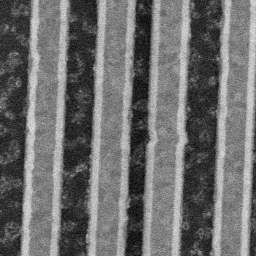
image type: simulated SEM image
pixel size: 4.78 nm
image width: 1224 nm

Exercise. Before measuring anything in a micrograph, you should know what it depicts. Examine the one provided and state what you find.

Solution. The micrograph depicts one or a few lines or trenches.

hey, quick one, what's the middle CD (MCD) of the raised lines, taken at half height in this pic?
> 137 nanometers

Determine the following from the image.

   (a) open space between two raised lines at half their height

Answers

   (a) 37.4 px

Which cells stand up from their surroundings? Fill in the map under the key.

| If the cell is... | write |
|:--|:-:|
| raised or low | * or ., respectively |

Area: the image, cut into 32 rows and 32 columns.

....****.....****...***......***
....****.....***....***.....****
....****.....***....***.....****
....****.....***...****.....****
....****.....***...****.....****
....****.....***...****.....****
....****....****...****.....****
....****.....***...****.....****
....****....****...****.....***.
....****....****...****.....***.
....****....****...****.....***.
....****....****...****.....***.
....****....****...****.....***.
....****....****...****.....***.
....****....****...****.....***.
....****....****...****.....***.
....***.....****...****.....***.
....***.....****...****.....***.
....***.....****...****.....***.
....***.....****...***......***.
....***.....****...***.....****.
....***.....****...***.....****.
....***.....****...***.....****.
....***.....****...***.....****.
...****.....***....***.....****.
...****.....***....***.....****.
...****.....***...****.....****.
...****.....***...****.....****.
...****.....***...****.....****.
...****.....***...****.....****.
...****.....***...****.....****.
...****....****...****.....***..